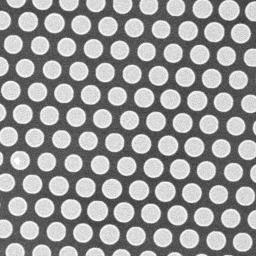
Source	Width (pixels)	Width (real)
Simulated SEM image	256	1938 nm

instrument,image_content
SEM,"an array of small figures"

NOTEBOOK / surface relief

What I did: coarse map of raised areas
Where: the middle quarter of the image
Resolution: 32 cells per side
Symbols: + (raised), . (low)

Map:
..++++...+++....++..............
..++++..++++...++++...++++...+++
..++++..++++...++++..+++++..++++
..+++...++++...++++..+++++..++++
................++....+++...++++
+.....++......................+.
++...++++...+++....++...........
++..+++++..+++++..++++...++++..+
++..+++++..++++...++++..+++++..+
+....+++....+++...++++..+++++..+
...................++....+++...+
..+++...........................
.++++...++++...+++...+++.....+..
.++++..+++++..+++++..++++...++++
.++++...++++..+++++..++++..+++++
..++....+++....+++...++++..+++++
......................++....+++.
+...++++....+...................
++..++++...++++...+++....++.....
++..++++...++++..+++++..++++...+
+...++++..+++++..+++++..++++..++
...........+++....+++...++++..++
.........................++....+
.+++....++.....++...............
++++...++++...++++...+++...++++.
++++...++++...++++..+++++..++++.
.+++...++++...++++..+++++..++++.
..............+++....+++...++++.
............................++..
+..++++...++++....++............
+..+++++..++++...++++..++++...++
+..+++++..++++..+++++..+++++..++